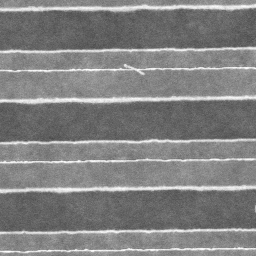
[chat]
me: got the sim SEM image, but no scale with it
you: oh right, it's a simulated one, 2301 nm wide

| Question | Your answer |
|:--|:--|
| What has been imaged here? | lines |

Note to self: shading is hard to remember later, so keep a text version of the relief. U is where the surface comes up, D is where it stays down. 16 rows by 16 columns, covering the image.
UUUUUUUUDDDDDDDD
DDDDDDDDDDDDDDDD
DDDDDDDDDDDDDDDD
UUUUUUUUUUUUUUUU
UUUUUUUUUUUUUUUU
UUUUUUUUUUUUUUUU
DDDDDDDDDDDDDDDD
DDDDDDDDDDDDDDDD
DDDDDDDDDDDDDDDD
UUUUUUUUUUUUUUUU
UUUUUUUUUUUUUUUU
UUUUUUUUUUUUUUUU
DDDDDDDDDDDDDDDD
DDDDDDDDDDDDDDDD
DDDDDDUUUUUUUUUU
UUUUUUUUUUUUUUUU